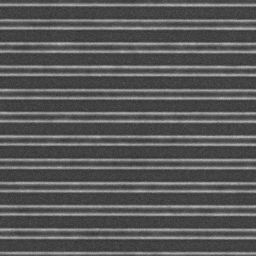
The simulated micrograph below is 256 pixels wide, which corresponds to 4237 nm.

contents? parallel lines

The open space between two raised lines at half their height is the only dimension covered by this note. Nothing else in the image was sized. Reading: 0.246 microns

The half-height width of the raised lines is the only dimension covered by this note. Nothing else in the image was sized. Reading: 149 nanometers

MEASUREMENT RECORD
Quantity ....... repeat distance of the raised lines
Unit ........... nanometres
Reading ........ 385